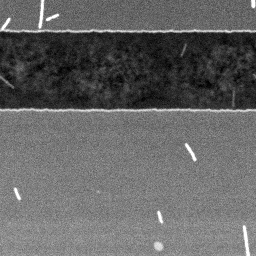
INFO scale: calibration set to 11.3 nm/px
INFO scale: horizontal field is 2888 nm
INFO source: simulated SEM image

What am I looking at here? one or a few lines or trenches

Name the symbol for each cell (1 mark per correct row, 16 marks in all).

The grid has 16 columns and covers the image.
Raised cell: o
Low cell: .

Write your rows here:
oooooooooooooooo
oooooooooooooooo
................
................
................
................
................
oooooooooooooooo
oooooooooooooooo
oooooooooooooooo
oooooooooooooooo
oooooooooooooooo
oooooooooooooooo
oooooooooooooooo
oooooooooooooooo
oooooooooooooooo